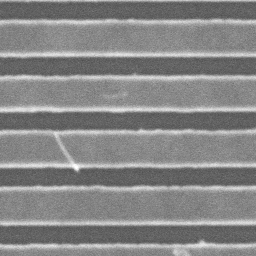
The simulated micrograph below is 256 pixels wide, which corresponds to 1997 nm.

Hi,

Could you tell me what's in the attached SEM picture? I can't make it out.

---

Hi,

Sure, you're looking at lines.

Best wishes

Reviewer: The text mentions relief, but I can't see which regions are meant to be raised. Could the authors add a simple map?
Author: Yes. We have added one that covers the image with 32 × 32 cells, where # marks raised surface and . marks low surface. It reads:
................................
................................
.............##.#.........###...
################################
################################
################################
################################
................................
................................
................................
################################
################################
################################
################################
................................
................................
################################
################################
################################
################################
################################
................................
................................
################################
################################
################################
################################
################################
................................
................................
................................
################################